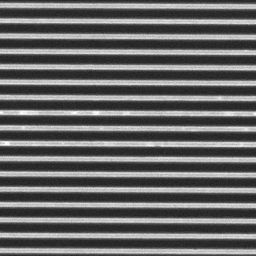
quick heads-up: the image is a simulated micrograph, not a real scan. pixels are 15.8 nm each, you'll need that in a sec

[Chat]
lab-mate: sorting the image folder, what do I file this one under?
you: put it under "parallel lines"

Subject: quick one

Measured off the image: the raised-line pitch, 241 nm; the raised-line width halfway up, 86.6 nm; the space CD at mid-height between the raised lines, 156 nm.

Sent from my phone